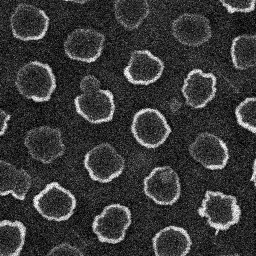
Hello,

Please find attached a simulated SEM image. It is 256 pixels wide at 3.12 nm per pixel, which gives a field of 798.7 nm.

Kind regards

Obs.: a regular array of raised bodies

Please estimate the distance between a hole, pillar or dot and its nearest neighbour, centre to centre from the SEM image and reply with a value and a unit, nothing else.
184 nanometres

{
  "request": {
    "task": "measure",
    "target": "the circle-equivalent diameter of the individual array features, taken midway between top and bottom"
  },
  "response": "37.4 px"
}